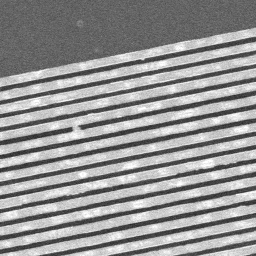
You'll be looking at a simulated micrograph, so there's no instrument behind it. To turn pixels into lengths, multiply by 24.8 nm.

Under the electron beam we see parallel lines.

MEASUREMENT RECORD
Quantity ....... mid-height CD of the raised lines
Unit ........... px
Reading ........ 8.34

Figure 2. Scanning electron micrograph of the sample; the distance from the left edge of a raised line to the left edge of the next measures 330 nm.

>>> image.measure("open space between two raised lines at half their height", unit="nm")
125